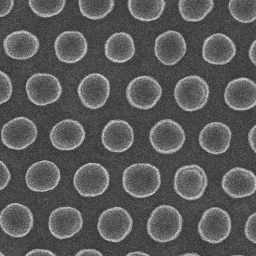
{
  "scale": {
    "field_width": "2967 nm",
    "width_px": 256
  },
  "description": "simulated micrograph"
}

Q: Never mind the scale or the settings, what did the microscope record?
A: a regular array of raised bodies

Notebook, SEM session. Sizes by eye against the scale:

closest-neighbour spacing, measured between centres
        569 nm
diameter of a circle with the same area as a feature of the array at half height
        377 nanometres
